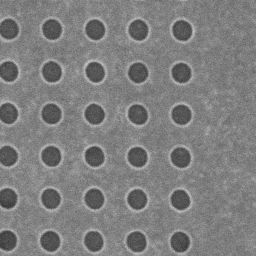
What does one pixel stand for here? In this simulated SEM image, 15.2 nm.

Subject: a regular array of holes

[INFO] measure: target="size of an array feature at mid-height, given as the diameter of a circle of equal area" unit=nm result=324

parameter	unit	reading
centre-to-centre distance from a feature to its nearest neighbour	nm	645